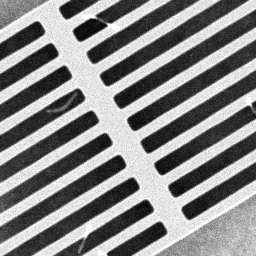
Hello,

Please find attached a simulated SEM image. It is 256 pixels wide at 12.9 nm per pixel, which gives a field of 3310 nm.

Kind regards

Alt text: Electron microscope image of groups of lines, slits or small figures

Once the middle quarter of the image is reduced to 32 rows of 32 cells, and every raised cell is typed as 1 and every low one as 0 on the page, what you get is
01111111111100000000111100000000
01111111111000000011111000000011
00111111100000000111100000000111
00111111100000011111000000011111
11111111110001111100000001111100
11111111111111110000000011111000
11001111111111100000001111100000
10000111111110000000011111000000
00000111111110000001111100000000
00000111111110000111110000000011
00011111111110001111100000001111
00111111111111111110000000011110
11111000111111111100000001111100
11100000111111110000000111111000
11000000011111110000001111100000
00000001111111110000111110000000
00000011111111111011111000000001
00001111100111111111110000000111
00011111000011111111000000001111
01111100000011111110000000111110
11110000000011111110000011111000
11100000001111111111000111110000
10000000111111111111111111000000
00000001111100011111111100000000
00000011111000011111111000000011
00001111000000001111111000000111
00111110000000111111111000011111
01111000000001111111111101111100
11110000000011111011111111111000
11000000001111100011111111100000
10000000111110000001111111000000
00000011111000000011111111000001